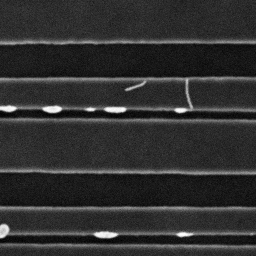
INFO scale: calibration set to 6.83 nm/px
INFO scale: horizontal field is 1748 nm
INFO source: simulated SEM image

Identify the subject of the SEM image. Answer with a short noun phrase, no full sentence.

lines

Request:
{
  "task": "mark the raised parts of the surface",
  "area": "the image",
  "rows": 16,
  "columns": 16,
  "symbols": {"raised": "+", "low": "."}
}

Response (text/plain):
++++++++++++++++
++++++++++++++++
++++++++++++++++
................
................
++++++++++++++++
++++++++++++++++
++++++++++++++++
++++++++++++++++
++++++++++++++++
++++++++++++++++
................
................
++++++++++++++++
++++++++++++++++
++++++++++++++++